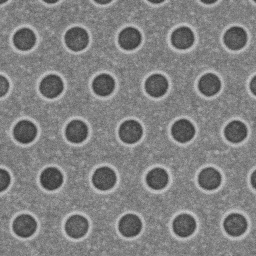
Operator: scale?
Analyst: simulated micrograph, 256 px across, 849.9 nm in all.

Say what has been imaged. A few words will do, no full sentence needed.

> a regular array of holes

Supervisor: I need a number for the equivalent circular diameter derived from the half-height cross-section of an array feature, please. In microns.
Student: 0.0844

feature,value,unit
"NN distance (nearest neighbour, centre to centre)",0.173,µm